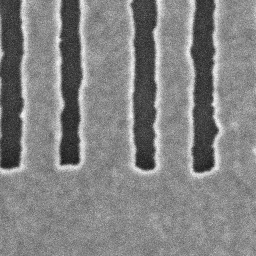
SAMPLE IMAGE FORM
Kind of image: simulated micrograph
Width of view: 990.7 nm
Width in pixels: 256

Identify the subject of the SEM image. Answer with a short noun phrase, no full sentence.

one or a few lines or trenches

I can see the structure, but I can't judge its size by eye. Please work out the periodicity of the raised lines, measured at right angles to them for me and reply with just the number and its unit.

258 nm